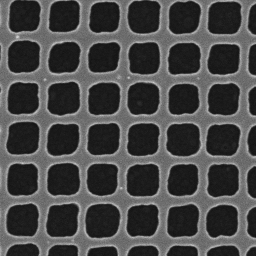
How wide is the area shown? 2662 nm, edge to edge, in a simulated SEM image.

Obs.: a regular array of holes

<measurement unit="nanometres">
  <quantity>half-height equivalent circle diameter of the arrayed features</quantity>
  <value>356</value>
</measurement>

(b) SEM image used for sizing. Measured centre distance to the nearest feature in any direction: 0.413 µm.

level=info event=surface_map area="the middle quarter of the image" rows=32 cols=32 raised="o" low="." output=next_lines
....oo.......ooo........oo......
...oooo......ooo.......ooo......
ooooooooooooooooooo...ooooo....o
oooooooooooooooooooooooooooooooo
o..ooooooooooooooooooooooooooooo
....ooo.......ooo......oooo.....
....oo........oo........oo......
....oo........oo........oo......
....oo........oo........oo......
....oo........oo........oo......
....oo........oo........oo......
...ooo.......ooo.......ooo......
.oooooo.....ooooo.....ooooo...o.
oooooooooooooooooooooooooooooooo
oooooooooooooooooooooooooooooooo
....ooo.......ooo......ooo......
....oo........oo........oo......
....oo........oo........oo......
....oo........oo........oo......
....oo........oo........oo......
....oo........oo........o.......
...ooo.......ooo.......ooo......
.oooooo.....oooo......ooooo.....
oooooooooooooooooooooooooooooooo
oooooooooooooooooooooooooooooooo
...oooo......oooo......ooooo....
....oo........oo........oo......
....oo.......ooo........oo......
....oo.......oo.........oo......
....oo........oo........oo......
....oo.......oo.........oo......
....oo.......ooo.......ooo......